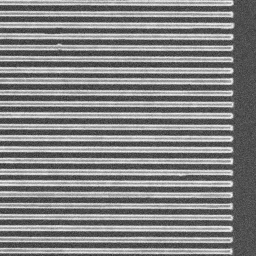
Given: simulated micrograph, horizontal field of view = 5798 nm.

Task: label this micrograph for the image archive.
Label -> parallel lines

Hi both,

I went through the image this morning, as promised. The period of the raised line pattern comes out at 256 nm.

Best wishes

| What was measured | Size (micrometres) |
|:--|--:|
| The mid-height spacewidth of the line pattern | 0.181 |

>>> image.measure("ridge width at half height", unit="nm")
90.6